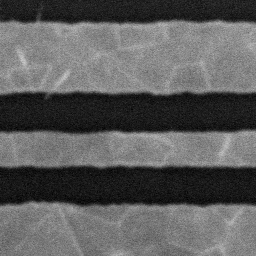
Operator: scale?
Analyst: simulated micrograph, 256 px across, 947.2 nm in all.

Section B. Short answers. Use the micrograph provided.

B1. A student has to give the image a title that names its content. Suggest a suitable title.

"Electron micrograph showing lines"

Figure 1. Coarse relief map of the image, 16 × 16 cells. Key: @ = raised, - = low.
----------------
@@@@-@@@@@@@@@@@
@@@@@@@@@@@@@@@@
@@@@@@@@@@@@@@@@
@@@@@@@@@@@@@@@@
@@@@@@@@@@@@@@@@
----------------
----------------
@@@@@@@@@@@@@@@@
@@@@@@@@@@@@@@@@
----------------
----------------
----------------
@@@@@@@@@@@@@@@@
@@@@@@@@@@@@@@@@
@@@@@@@@@@@@@@@@